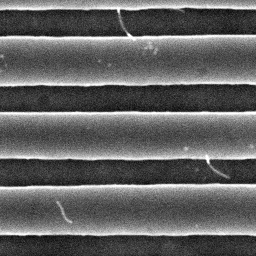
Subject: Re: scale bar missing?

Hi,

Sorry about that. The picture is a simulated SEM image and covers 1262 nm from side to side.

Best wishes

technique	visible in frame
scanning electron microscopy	lines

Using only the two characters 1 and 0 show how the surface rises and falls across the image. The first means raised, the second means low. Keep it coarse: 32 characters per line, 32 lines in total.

11111111111111111111111111111111
00000000000000000000000000000000
00000000000000000000000000000000
00000000000000000000000000000000
00000000000000000000000000111111
11111111111111111111111111111111
11111111111111111111111111111111
11111111111111111111111111111111
11111111111111111111111111111111
11111111111111111111111111111111
11111111111111111110110000000001
00000000000000000000000000000000
00000000000000000000000000000000
00000000000000000000000000000000
11111111111111111111111111111111
11111111111111111111111111111111
11111111111111111111111111111111
11111111111111111111111111111111
11111111111111111111111111111111
11111111111111111111111111111111
00000000000000000000000000000000
00000000000000000000000000000000
00000000000000000000000000000000
11111111111111111111111111111111
11111111111111111111111111111111
11111111111111111111111111111111
11111111111111111111111111111111
11111111111111111111111111111111
11111111111111111111111111111111
00000000000000000000000000000000
00000000000000000000000000000000
00000000000000000000000000000000